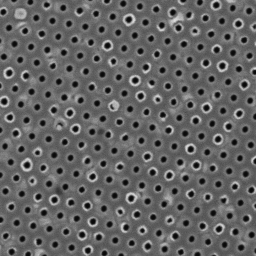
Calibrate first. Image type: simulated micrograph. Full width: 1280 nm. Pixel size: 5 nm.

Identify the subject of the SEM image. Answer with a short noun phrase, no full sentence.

a regular array of holes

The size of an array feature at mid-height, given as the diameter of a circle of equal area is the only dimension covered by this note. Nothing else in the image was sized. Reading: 29.3 nm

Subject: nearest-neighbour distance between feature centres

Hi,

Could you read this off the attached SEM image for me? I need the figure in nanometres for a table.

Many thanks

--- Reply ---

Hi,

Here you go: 82.3